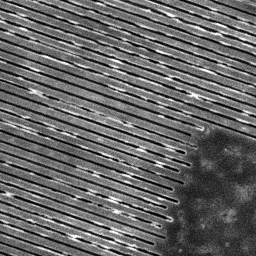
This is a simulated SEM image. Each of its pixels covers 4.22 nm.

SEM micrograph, parallel lines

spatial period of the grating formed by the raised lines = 0.0405 um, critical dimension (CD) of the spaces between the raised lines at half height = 12.5 nanometers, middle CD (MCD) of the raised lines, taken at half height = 6.97 pixels